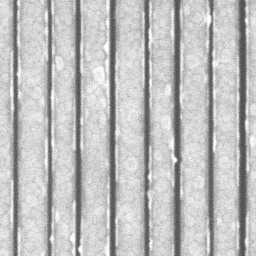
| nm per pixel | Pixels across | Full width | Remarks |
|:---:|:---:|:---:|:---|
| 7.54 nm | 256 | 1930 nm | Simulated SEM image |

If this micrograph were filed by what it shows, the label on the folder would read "parallel lines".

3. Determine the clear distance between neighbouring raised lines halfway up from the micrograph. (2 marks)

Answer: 162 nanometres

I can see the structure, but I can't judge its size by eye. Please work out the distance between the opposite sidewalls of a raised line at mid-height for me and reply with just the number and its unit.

67.9 nm